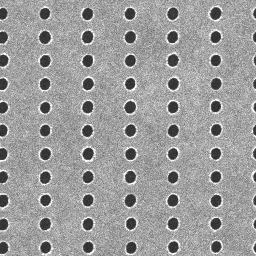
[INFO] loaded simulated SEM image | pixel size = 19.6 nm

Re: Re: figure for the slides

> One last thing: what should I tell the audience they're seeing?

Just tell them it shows a regular array of holes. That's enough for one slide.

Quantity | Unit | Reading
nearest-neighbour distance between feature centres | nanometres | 454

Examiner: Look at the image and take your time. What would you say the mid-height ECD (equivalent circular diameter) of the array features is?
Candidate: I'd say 224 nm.